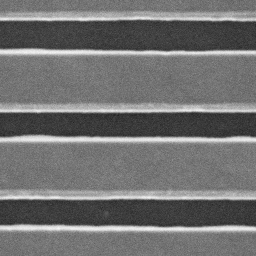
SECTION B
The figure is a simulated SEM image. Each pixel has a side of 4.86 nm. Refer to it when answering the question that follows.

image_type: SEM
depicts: lines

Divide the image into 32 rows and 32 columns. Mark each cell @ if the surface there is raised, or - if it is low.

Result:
@@@@@@@@@@@@@@@@@@@@@@@@@@@@@@@@
@@@@@@@@@@@@@@@@@@@@@@@@@@@@@@@@
--------------------------------
--------------------------------
--------------------------------
--------------------------------
--------------------------------
@@@@@@@@@@@@@@@@@@@@@@@@@@@@@@@@
@@@@@@@@@@@@@@@@@@@@@@@@@@@@@@@@
@@@@@@@@@@@@@@@@@@@@@@@@@@@@@@@@
@@@@@@@@@@@@@@@@@@@@@@@@@@@@@@@@
@@@@@@@@@@@@@@@@@@@@@@@@@@@@@@@@
@@@@@@@@@@@@@@@@@@@@@@@@@@@@@@@@
@@@@@@@@@@@@@@@@@@@@@@@@@@@@@@@@
--------------------------------
--------------------------------
--------------------------------
@@@@@@@@@@@@@@@@@@@@@@@@@@@@@@@@
@@@@@@@@@@@@@@@@@@@@@@@@@@@@@@@@
@@@@@@@@@@@@@@@@@@@@@@@@@@@@@@@@
@@@@@@@@@@@@@@@@@@@@@@@@@@@@@@@@
@@@@@@@@@@@@@@@@@@@@@@@@@@@@@@@@
@@@@@@@@@@@@@@@@@@@@@@@@@@@@@@@@
@@@@@@@@@@@@@@@@@@@@@@@@@@@@@@@@
@@@@@@@@@@@@@@@@@@@@@@@@@@@@@@@@
--------------------------------
--------------------------------
--------------------------------
@@@@@@@@@@@---------------------
@@@@@@@@@@@@@@@@@@@@@@@@@@@@@@@@
@@@@@@@@@@@@@@@@@@@@@@@@@@@@@@@@
@@@@@@@@@@@@@@@@@@@@@@@@@@@@@@@@